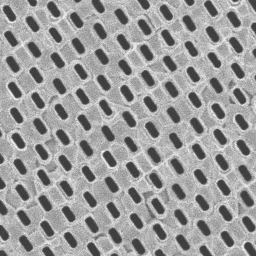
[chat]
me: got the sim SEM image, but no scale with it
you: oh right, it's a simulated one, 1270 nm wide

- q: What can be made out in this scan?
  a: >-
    a regular array of holes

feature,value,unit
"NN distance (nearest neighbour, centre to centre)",126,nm